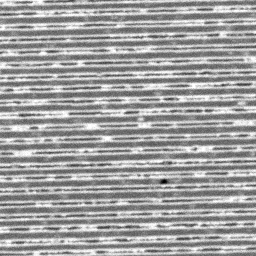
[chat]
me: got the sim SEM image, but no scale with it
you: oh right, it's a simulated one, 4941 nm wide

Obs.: parallel lines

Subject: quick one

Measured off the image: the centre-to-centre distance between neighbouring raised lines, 244 nm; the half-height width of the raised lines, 96.4 nm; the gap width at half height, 147 nanometres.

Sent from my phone